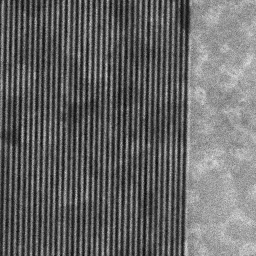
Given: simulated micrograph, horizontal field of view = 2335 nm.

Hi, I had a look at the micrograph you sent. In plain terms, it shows parallel lines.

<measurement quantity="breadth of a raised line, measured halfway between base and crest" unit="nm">16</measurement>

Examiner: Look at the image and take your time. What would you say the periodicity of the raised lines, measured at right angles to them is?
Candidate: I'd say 50.2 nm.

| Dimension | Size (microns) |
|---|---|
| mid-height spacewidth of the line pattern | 0.0319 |